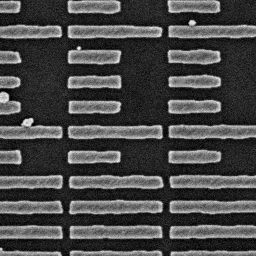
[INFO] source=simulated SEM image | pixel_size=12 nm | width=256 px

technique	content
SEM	wiring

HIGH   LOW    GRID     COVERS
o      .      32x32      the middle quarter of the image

................................
................................
................................
..oooooooooooo.............ooooo
.ooooooooooooo............oooooo
.ooooooooooooo.............ooooo
................................
................................
................................
..ooooooo.................oooooo
.ooooooooooooo............oooooo
.ooooooooooooo............oooooo
................................
................................
................................
................................
.ooooooooooooooooooooooo...ooooo
.ooooooooooooooooooooooo...ooooo
...oooo..........o.............o
................................
................................
................................
.ooooooooooooo............oooooo
.ooooooooooooo............oooooo
..ooooo....................oooo.
................................
................................
................................
..oooooooooooooooooooooo...ooooo
..oooooooooooooooooooooo...ooooo
..ooooooooooooooooooooooo..ooooo
................................